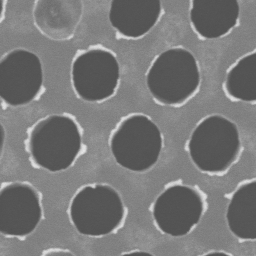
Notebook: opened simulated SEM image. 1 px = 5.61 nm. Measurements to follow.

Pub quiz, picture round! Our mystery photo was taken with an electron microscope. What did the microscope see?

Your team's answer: holes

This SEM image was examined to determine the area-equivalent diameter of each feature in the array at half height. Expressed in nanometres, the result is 289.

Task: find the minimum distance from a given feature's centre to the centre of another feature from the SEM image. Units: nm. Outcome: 431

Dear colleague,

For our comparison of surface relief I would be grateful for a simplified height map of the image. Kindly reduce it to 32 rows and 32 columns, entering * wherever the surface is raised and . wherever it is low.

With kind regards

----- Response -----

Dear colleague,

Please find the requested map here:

**************......****......**
**************......****......**
**************......****......**
**************.....*****.....***
****************.********...****
********************************
*...*******..********...********
*....*****....*****.....******..
.....****......****......****...
.....****......***.......***....
.....****......***.......***....
.....*****....*****.....*****...
*...*******.********...*******..
********************************
*****************.**************
*****....******....******....***
****......*****.....****......**
****......****......****......**
****......****......****......**
****.....*****......****.....***
*****....******....******....***
********************************
********************************
*...*******...*******...******..
.....****......*****.....****...
.....****......*****.....****...
.....****......****......***....
.....****......*****.....***....
....*****.....******....*****...
******************************..
********************************
*****************.**************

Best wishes